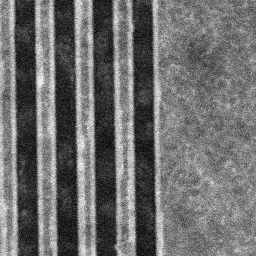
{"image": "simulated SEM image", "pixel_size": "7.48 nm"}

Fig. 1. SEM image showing parallel lines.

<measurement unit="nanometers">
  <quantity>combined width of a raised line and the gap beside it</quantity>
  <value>293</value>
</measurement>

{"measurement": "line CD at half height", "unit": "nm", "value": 103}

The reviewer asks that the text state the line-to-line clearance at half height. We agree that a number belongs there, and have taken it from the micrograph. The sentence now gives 194 nm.